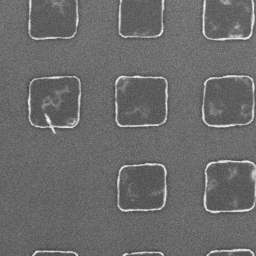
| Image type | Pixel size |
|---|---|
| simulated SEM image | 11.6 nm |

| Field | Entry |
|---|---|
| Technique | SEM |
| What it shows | raised bodies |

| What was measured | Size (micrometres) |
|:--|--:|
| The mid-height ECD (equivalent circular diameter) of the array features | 0.642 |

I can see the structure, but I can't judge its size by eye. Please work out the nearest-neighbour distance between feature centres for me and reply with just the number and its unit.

1000 nm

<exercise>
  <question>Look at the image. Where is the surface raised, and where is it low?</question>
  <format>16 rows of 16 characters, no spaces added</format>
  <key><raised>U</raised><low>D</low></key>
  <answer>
DDUUUDDDUUDDDUUU
DDUUUDDUUUDDDUUU
DDDDDDDDDDDDDDDD
DDDDDDDDDDDDDDDD
DDDDDDDDDDDDDDDD
DDUUUDDUUUDDDUUU
DDUUUDDUUUDDDUUU
DDUUUDDUUUDDDUUU
DDDDDDDDDDDDDDDD
DDDDDDDDDDDDDDDD
DDDDDDDDUUDDDUUU
DDDDDDDUUUDDDUUU
DDDDDDDUUUDDDUUU
DDDDDDDDDDDDDDDD
DDDDDDDDDDDDDDDD
DDDDDDDDDDDDDDDD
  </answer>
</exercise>